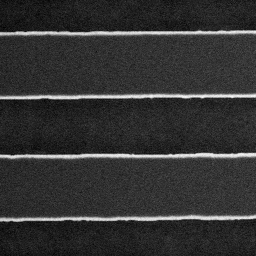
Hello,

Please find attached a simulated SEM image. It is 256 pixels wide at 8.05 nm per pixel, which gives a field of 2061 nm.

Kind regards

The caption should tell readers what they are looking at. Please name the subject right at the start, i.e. lines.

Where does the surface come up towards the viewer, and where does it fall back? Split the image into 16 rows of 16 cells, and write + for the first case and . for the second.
................
................
++++++++++++++++
++++++++++++++++
++++++++++++++++
++++++++++++++++
................
................
................
................
++++++++++++++++
++++++++++++++++
++++++++++++++++
++++++++++++++++
................
................